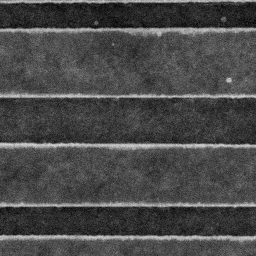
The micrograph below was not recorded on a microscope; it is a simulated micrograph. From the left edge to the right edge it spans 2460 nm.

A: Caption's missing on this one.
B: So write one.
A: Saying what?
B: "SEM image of lines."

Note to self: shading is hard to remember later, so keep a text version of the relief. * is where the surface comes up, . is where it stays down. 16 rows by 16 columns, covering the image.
................
................
****************
****************
****************
****************
................
................
................
****************
****************
****************
****************
................
................
****************